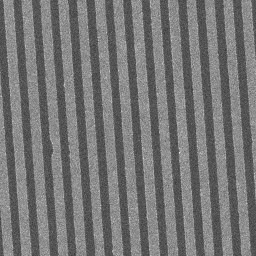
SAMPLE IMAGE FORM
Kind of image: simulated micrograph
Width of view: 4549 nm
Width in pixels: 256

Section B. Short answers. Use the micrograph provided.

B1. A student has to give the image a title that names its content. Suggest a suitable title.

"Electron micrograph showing parallel lines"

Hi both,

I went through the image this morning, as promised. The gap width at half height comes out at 157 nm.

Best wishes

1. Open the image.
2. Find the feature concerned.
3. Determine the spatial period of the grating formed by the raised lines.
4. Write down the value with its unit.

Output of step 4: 0.325 micrometres